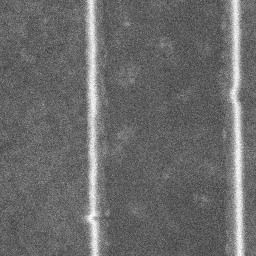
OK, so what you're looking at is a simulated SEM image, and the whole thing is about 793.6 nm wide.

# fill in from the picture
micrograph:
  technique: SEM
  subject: one or a few lines or trenches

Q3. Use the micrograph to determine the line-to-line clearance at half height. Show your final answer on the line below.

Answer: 447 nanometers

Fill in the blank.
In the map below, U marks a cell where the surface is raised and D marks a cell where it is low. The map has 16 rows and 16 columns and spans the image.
UUUUUUDDDDDDDDDU
UUUUUUDDDDDDDDDU
UUUUUUDDDDDDDDDU
UUUUUUDDDDDDDDDU
UUUUUUDDDDDDDDDU
UUUUUUDDDDDDDDDU
UUUUUUDDDDDDDDDU
UUUUUUDDDDDDDDDU
UUUUUUDDDDDDDDDU
UUUUUUDDDDDDDDDU
UUUUUUDDDDDDDDDU
UUUUUUDDDDDDDDDU
UUUUUUDDDDDDDDDU
UUUUUUDDDDDDDDDU
UUUUUUDDDDDDDDDU
UUUUUUDDDDDDDDDU